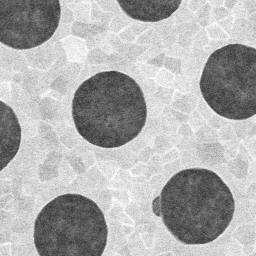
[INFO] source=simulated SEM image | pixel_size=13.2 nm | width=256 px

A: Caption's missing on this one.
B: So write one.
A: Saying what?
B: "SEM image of holes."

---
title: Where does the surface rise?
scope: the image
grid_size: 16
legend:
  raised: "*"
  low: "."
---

....****...*****
....************
...*************
*************...
******.******...
*****....****...
*****....****...
.****....*******
.****....*******
.***************
****************
**********....**
***...****.....*
**.....***.....*
**.....****...**
**.....*********